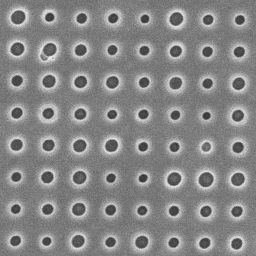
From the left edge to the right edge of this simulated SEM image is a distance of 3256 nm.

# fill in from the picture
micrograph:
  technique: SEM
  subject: a regular array of holes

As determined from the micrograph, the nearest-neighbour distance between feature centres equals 31.2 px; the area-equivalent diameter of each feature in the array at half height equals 148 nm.